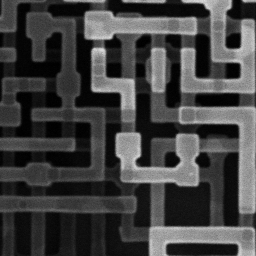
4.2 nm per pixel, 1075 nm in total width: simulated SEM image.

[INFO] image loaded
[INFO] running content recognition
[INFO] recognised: wiring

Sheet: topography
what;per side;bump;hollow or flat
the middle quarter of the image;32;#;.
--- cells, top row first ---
###....###....####...######..###
###....###....####...######..###
####...###....####...######..###
####...####...####...######..###
####...###########...#####...###
####...###########....###....###
####...###########....###....###
####..........####....###....###
###...........####....###....###
###...........####....###....###
###...........####....####...###
##########....####....##########
##########....####....##########
##########....####....##########
###...####....####...........###
###....###....####..............
###....###....####..............
###....###...######.............
###....###...######.........####
###....###...######...##########
###....###...######...##########
###....###...######...##########
.......###...######...###...####
.......###....####....###....###
.......###....####....###....###
.......###...######...###...####
################################
################################
################################
.............######..#####..####
.............#####....###.......
..............###.....###.......